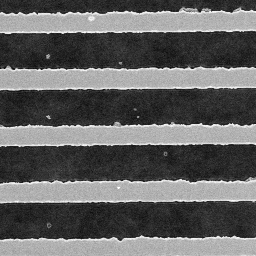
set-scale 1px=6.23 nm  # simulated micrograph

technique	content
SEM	lines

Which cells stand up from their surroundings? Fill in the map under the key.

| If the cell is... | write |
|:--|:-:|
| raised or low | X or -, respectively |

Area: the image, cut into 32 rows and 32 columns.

--------------------------------
--------------XX----XXXXXXXX-XXX
XXXXXXXXXXXXXXXXXXXXXXXXXXXXXXXX
XXXXXXXXXXXXXXXXXXXXXXXXXXXXXXXX
--------------------------------
--------------------------------
--------------------------------
--------------------------------
---------------------------X--X-
XXXXXXXXXXXXXXXXXXXXXXXXXXXXXXXX
XXXXXXXXXXXXXXXXXXXXXXXXXXXXXXXX
--------------------------------
--------------------------------
--------------------------------
--------------------------------
--------------X-----------------
XXXXXXXXXXXXXXXXXXXXXXXXXXXXXXXX
XXXXXXXXXXXXXXXXXXXXXXXXXXXXXXXX
--------------------------------
--------------------------------
--------------------------------
--------------------------------
-------------------------------X
XXXXXXXXXXXXXXXXXXXXXXXXXXXXXXXX
XXXXXXXXXXXXXXXXXXXXXXXXXXXXXXXX
--------------------------------
--------------------------------
--------------------------------
--------------------------------
--------------------------------
XXXXXXXXXXXXXXXXXXXXXXXXXXXXXXXX
XXXXXXXXXXXXXXXXXXXXXXXXXXXXXXXX